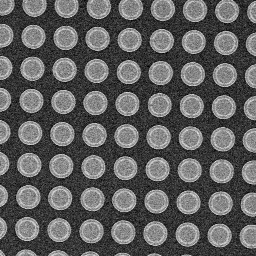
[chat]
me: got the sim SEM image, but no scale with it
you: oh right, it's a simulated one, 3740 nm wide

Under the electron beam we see an array of small figures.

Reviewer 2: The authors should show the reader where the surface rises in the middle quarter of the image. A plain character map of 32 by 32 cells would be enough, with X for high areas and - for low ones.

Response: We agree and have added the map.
XXX---XXXXX---XXXXX---XXXXX---XX
XXX--XXXXXX--XXXXXX--XXXXXX--XXX
XXX--XXXXXX--XXXXXX--XXXXXX--XXX
XX----XXXXX---XXXXX--XXXXXX--XXX
-------XX------XXX----XXXX----XX
--------------------------------
--------------------------------
XX----XXXX----XXX------XX-------
XXX--XXXXXX--XXXXX----XXXX----XX
XXX--XXXXXX--XXXXXX--XXXXXX--XXX
XXX--XXXXXX--XXXXXX--XXXXXX--XXX
XX----XXXX---XXXXX---XXXXXX--XXX
-------XX-----XXX-----XXXX----XX
--------------------------------
--------------------------------
XX----XXX-----XXX------XX-------
XX---XXXXX---XXXXX---XXXXX----XX
XX---XXXXXX--XXXXXX--XXXXXX--XXX
XX---XXXXXX--XXXXXX--XXXXXX--XXX
XX---XXXXX---XXXXX---XXXXX---XXX
------XXX-----XXX-----XXXX---XXX
--------------------------------
--------------------------------
X-----XXX-----XXX---------------
XX---XXXXX---XXXXX---XXXXX---XXX
XX--XXXXXX---XXXXX---XXXXX---XXX
XX---XXXXX---XXXXX---XXXXX---XXX
XX---XXXXX---XXXXX---XXXXX---XXX
------XX------XXX----XXXX----XXX
--------------------------------
--------------------------------
X----XXXX-----XX----------------